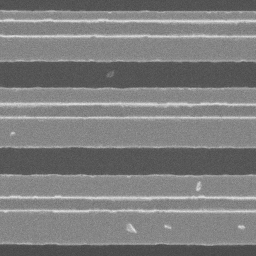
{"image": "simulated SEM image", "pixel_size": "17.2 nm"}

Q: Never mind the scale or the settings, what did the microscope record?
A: lines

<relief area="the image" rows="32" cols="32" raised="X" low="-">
--------------------------------
XXXXXXXXXXXXXXXXXXXXXXXXXXXXXXXX
XXXXXXXXXXXXXXXXXXXXXXXXXXXXXXXX
XXXXXXXXXXXXXXXXXXXXXXXXXXXXXXXX
XXXXXXXXXXXXXXXXXXXXXXXXXXXXXXXX
XXXXXXXXXXXXXXXXXXXXXXXXXXXXXXXX
XXXXXXXXXXXXXXXXXXXXXXXXXXXXXXXX
XXXXXXXXXXXXXXXXXXXXXXXXXXXXXXXX
--------------------------------
--------------------------------
--------------------------------
XXXXXXXXXXXXXXXXXXXXXXXXXXXXXXXX
XXXXXXXXXXXXXXXXXXXXXXXXXXXXXXXX
XXXXXXXXXXXXXXXXXXXXXXXXXXXXXXXX
XXXXXXXXXXXXXXXXXXXXXXXXXXXXXXXX
XXXXXXXXXXXXXXXXXXXXXXXXXXXXXXXX
XXXXXXXXXXXXXXXXXXXXXXXXXXXXXXXX
XXXXXXXXXXXXXXXXXXXXXXXXXXXXXXXX
--------------------------------
--------------------------------
--------------------------------
--------------------------------
XXXXXXXXXXXXXXXXXXXXXXXXXXXXXXXX
XXXXXXXXXXXXXXXXXXXXXXXXXXXXXXXX
XXXXXXXXXXXXXXXXXXXXXXXXXXXXXXXX
XXXXXXXXXXXXXXXXXXXXXXXXXXXXXXXX
XXXXXXXXXXXXXXXXXXXXXXXXXXXXXXXX
XXXXXXXXXXXXXXXXXXXXXXXXXXXXXXXX
XXXXXXXXXXXXXXXXXXXXXXXXXXXXXXXX
XXXXXXXXXXXXXXXXXXXXXXXXXXXXXXXX
--XXXX-XXXXXXXXXXXXXXXXXXXXXXXXX
--------------------------------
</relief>